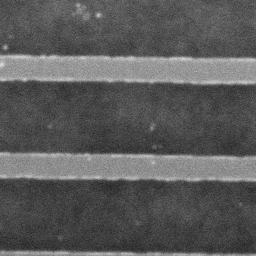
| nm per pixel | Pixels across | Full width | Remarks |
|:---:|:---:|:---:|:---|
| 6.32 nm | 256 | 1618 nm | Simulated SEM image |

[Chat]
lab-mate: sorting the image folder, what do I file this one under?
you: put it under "lines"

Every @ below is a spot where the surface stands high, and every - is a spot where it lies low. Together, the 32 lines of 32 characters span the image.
--------------------------------
--------------------------------
--------------------------------
--------------------------------
--------------------------------
--------------------------------
--------------------------------
@@@@@@@@@@@@@@@@@@@@@@@@@@@@@@@@
@@@@@@@@@@@@@@@@@@@@@@@@@@@@@@@@
@@@@@@@@@@@@@@@@@@@@@@@@@@@@@@@@
--------------------------------
--------------------------------
--------------------------------
--------------------------------
--------------------------------
--------------------------------
--------------------------------
--------------------------------
--------------------------------
@@@@@@@@@@@@@@@@@@@-------------
@@@@@@@@@@@@@@@@@@@@@@@@@@@@@@@@
@@@@@@@@@@@@@@@@@@@@@@@@@@@@@@@@
--------------------@@-@@--@@@@@
--------------------------------
--------------------------------
--------------------------------
--------------------------------
--------------------------------
--------------------------------
--------------------------------
--------------------------------
--------------------------------